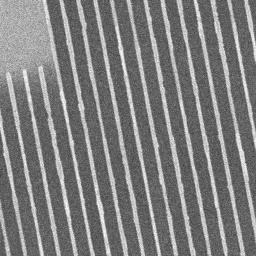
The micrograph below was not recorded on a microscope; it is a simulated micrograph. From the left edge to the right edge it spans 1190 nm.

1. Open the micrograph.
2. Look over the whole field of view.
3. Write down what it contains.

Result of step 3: parallel lines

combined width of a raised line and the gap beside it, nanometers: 76.7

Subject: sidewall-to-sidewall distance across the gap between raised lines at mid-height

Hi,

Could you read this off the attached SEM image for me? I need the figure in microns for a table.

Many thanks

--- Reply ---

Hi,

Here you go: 0.0612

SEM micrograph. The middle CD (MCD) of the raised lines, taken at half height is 16.5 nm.